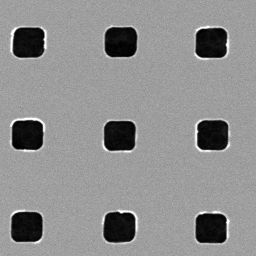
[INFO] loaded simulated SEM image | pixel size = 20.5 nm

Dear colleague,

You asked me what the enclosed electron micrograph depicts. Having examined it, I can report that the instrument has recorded a regular array of holes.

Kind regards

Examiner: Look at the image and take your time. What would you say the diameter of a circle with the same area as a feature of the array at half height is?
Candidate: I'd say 33.8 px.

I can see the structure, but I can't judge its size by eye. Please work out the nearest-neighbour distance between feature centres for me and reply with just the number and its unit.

1.88 µm